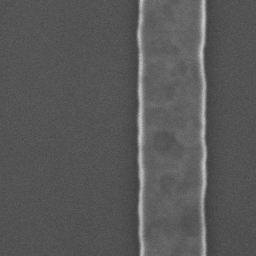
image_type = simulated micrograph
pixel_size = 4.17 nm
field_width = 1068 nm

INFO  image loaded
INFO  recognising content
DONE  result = one or a few lines or trenches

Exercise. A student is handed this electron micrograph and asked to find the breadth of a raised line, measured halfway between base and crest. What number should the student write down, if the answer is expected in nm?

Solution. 265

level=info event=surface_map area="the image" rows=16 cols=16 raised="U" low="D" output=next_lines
DDDDDDDDDUUUUDDD
DDDDDDDDDUUUUDDD
DDDDDDDDDUUUUDDD
DDDDDDDDDUUUUDDD
DDDDDDDDDUUUUDDD
DDDDDDDDDUUUUDDD
DDDDDDDDDUUUUDDD
DDDDDDDDDUUUUDDD
DDDDDDDDDUUUUDDD
DDDDDDDDDUUUUDDD
DDDDDDDDDUUUUDDD
DDDDDDDDDUUUUDDD
DDDDDDDDDUUUUDDD
DDDDDDDDDUUUUDDD
DDDDDDDDDUUUUDDD
DDDDDDDDDUUUUDDD